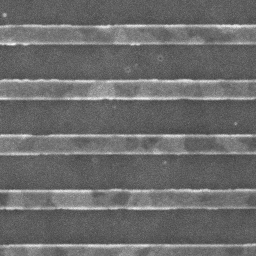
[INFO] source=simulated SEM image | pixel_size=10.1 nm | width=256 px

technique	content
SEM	lines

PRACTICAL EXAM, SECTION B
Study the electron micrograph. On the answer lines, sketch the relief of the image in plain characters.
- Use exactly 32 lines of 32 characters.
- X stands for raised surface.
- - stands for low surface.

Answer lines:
--------------------------------
--------------------------------
--------------------------------
XXXXXXXXXXXXXXXXXXXXXXXXXXXXXXXX
XXXXXXXXXXXXXXXXXXXXXXXXXXXXXXXX
XXXX------------XX--------------
--------------------------------
--------------------------------
--------------------------------
--------------------------------
XXXXXXXXXXXXXXXXXXXXXXXXXXXXXXXX
XXXXXXXXXXXXXXXXXXXXXXXXXXXXXXXX
--------------------------------
--------------------------------
--------------------------------
--------------------------------
--------------------------------
XXXXXXXXXXXXXXXXXXXXXXXXXXXXXXXX
XXXXXXXXXXXXXXXXXXXXXXXXXXXXXXXX
--------------------------------
--------------------------------
--------------------------------
--------------------------------
--------------------------------
XXXXXXXXXXXXXXXXXXXXXXXXXXXXXXXX
XXXXXXXXXXXXXXXXXXXXXXXXXXXXXXXX
--------------------------------
--------------------------------
--------------------------------
--------------------------------
--------------------------------
XXXXXXXXXXXXXXXXXXXXXXXXXXXXXXXX